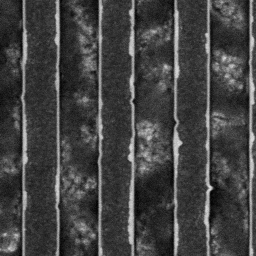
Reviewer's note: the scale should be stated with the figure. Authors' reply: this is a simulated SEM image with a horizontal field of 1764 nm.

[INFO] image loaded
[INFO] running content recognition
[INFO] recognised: one or a few lines or trenches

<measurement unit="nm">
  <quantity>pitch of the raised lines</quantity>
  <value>520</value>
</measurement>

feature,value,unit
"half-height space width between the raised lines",290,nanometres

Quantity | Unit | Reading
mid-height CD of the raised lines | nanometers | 230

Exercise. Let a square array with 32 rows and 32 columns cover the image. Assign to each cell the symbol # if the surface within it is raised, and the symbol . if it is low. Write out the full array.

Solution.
...####......####.....####.....#
...####......####.....####.....#
...####......####.....####.....#
...####......####.....####.....#
...####......####.....####.....#
...####......####.....####.....#
...####......####.....####.....#
...####......####.....####.....#
...####......####.....####.....#
...####......####.....####.....#
...####......####.....####.....#
...####......####.....####.....#
...####.....#####.....####.....#
...####.....#####.....####.....#
...####......####.....####.....#
...####......####.....####.....#
...####......####.....####.....#
...####......####.....####.....#
...####......####.....####.....#
...####......####.....####.....#
...####.....#####.....####.....#
...####......####.....####.....#
...####......####.....####.....#
...####......####.....####.....#
...####......####.....####.....#
...####......####.....####.....#
...####......####.....####.....#
...####......####.....####.....#
...####......####.....####.....#
...####......####.....####.....#
...####......####.....####.....#
...####......####.....####.....#